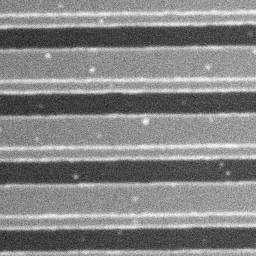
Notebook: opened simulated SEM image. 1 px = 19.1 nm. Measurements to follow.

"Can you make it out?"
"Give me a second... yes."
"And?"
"lines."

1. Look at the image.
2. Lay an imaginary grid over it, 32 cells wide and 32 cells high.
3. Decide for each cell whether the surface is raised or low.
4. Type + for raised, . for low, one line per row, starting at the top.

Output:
++++++++++++++++++++++++++++++++
++++++++++++++++++++++++++++++++
++++++++++++++++++++++++++++++++
................................
................................
................................
++++++++++++++++++++++++++++++++
++++++++++++++++++++++++++++++++
++++++++++++++++++++++++++++++++
++++++++++++++++++++++++++++++++
++++++++++++++++++++++++++++++++
++++++++++++++.+++..............
................................
................................
.............+++..++++++++++++++
++++++++++++++++++++++++++++++++
++++++++++++++++++++++++++++++++
++++++++++++++++++++++++++++++++
++++++++++++++++++++++++++++++++
++++++++++++++++++++++++++++++++
................................
................................
................................
++++++++++++++++++++++++++++++++
++++++++++++++++++++++++++++++++
++++++++++++++++++++++++++++++++
++++++++++++++++++++++++++++++++
++++++++++++++++++++++++++++++++
+++++.+.........................
................................
................................
.........+++++++++++++++++++++++